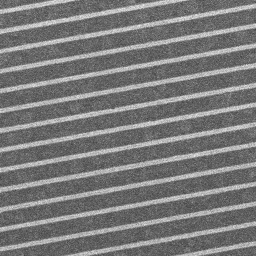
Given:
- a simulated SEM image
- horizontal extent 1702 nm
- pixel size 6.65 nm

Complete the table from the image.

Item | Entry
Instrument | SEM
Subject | parallel lines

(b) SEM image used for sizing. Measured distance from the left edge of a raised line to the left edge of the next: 130 nanometers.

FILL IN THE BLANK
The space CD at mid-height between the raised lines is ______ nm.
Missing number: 106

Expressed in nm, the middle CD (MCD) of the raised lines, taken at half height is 24.6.